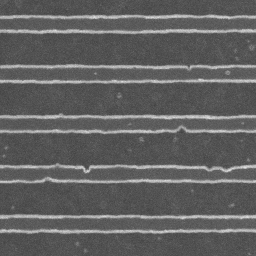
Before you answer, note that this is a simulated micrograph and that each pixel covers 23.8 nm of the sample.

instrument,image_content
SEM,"parallel lines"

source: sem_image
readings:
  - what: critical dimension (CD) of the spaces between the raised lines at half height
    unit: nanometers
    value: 820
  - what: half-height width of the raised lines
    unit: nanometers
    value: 359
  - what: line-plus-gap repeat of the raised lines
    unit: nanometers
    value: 1190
